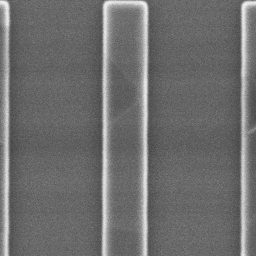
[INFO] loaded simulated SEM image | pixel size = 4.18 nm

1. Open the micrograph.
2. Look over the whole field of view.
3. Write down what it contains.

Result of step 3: wiring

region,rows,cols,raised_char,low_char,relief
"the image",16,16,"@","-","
-------@@------@
-------@@------@
-------@@------@
-------@@------@
-------@@------@
-------@@------@
-------@@------@
-------@@------@
-------@@------@
-------@@------@
-------@@------@
-------@@------@
-------@@------@
-------@@------@
-------@@------@
-------@@------@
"